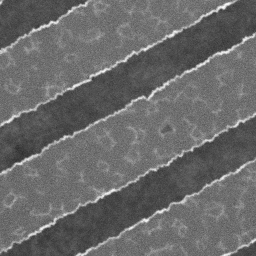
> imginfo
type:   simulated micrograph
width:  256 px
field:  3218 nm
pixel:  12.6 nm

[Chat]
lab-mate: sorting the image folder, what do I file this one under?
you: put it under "one or a few lines or trenches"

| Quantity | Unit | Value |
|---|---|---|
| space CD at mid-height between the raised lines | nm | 508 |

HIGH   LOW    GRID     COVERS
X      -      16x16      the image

-----XXXXXXXXX--
---XXXXXXXXX----
-XXXXXXXXX-----X
XXXXXXXX-----XXX
XXXXXX------XXXX
XXXX------XXXXXX
XXX-----XXXXXXXX
X-----XXXXXXXXX-
----XXXXXXXXXX--
---XXXXXXXXX----
-XXXXXXXXX-----X
XXXXXXXX-----XXX
XXXXXX-----XXXXX
XXXX------XXXXXX
XX------XXXXXXXX
------XXXXXXXXX-